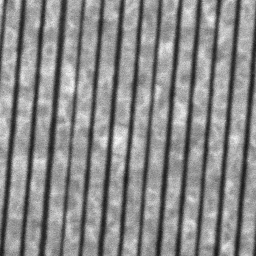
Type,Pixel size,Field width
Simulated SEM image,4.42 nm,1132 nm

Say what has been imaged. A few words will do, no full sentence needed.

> parallel lines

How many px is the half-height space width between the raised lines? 5.09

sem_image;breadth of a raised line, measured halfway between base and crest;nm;63.8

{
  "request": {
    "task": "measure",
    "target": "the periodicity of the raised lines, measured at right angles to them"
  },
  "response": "0.0859 micrometres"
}